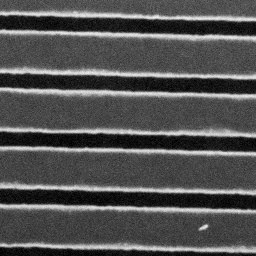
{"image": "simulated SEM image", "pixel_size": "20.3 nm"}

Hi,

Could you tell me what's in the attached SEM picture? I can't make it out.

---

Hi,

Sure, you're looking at lines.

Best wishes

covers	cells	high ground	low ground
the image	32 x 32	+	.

++++++++++++++++++++++++++++++++
++++++++++++++++++++++++++++++++
.............................+++
................................
+++++++++++++++++++++++.........
++++++++++++++++++++++++++++++++
++++++++++++++++++++++++++++++++
++++++++++++++++++++++++++++++++
++++++++++++++++++++++++++++++++
.....................+++++++++++
................................
+++++++++++++++.................
++++++++++++++++++++++++++++++++
++++++++++++++++++++++++++++++++
++++++++++++++++++++++++++++++++
++++++++++++++++++++++++++++++++
.....+++++++++++++++++++++++++++
................................
++++............................
++++++++++++++++++++++++++++++++
++++++++++++++++++++++++++++++++
++++++++++++++++++++++++++++++++
++++++++++++++++++++++++++++++++
...+++++++++++++++++++++++++++++
................................
................................
++++++++++++++++++++++++++++++++
++++++++++++++++++++++++++++++++
++++++++++++++++++++++++++++++++
++++++++++++++++++++++++++++++++
++++++++++++++++++++++++++++++++
................................